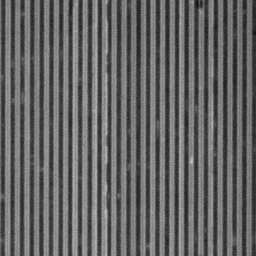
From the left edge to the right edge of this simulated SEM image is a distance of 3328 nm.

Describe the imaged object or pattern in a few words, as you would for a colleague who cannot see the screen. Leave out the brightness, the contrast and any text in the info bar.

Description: parallel lines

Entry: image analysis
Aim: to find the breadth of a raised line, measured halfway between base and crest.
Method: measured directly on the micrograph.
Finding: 61.7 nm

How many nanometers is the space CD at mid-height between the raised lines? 63.4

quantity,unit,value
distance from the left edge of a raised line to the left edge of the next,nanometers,126